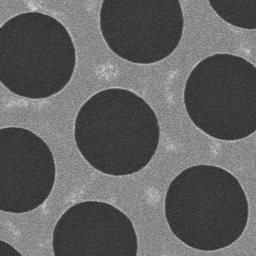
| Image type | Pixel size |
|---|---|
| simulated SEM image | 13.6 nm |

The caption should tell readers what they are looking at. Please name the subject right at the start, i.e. holes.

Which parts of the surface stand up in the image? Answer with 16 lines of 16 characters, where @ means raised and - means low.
@@@@@@-----@@---
----@@-----@@@--
-----@@----@@@@@
-----@@---@@@--@
-----@@@@@@@----
----@@@@@@@@----
@@@@@----@@@----
@@@@@-----@@----
--@@@-----@@@--@
---@@-----@@@@@@
---@@@---@@@--@@
---@@@@@@@@----@
---@@@@@@@-----@
@@@@----@@------
@@@-----@@@----@
-@@------@@@--@@